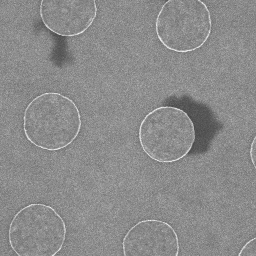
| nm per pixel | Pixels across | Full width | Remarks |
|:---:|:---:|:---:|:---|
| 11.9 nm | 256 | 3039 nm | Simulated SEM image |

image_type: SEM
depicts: raised bodies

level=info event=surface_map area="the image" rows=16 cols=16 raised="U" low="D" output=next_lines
DDDUUUDDDDUUUDDD
DDDUUUDDDDUUUDDD
DDDDDDDDDDUUUDDD
DDDDDDDDDDDDDDDD
DDDDDDDDDDDDDDDD
DDDDDDDDDDDDDDDD
DDUUUDDDDDDDDDDD
DDUUUDDDDUUUDDDD
DDUUUDDDDUUUDDDD
DDDDDDDDDUUUDDDD
DDDDDDDDDDDDDDDD
DDDDDDDDDDDDDDDD
DDDDDDDDDDDDDDDD
DUUUDDDDDDDDDDDD
DUUUDDDDUUUDDDDD
DUUUDDDDUUUDDDDU